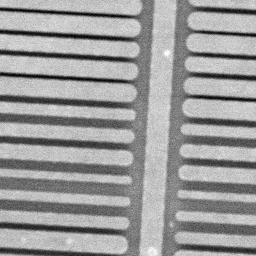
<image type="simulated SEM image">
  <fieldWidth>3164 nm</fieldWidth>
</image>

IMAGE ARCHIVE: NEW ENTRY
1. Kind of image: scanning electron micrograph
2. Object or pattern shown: groups of lines, slits or small figures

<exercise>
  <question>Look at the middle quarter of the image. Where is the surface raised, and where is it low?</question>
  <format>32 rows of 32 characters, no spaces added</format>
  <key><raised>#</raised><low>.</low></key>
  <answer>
##################....#####...##
##################....#####....#
##################....#####.....
...........#######....#####.....
#######...............#####...##
#################.....#####...##
##################....#####...##
##################...######.....
##################...#####......
.....................#####....##
.....................#####....##
################.....#####....##
##################...#####....##
........##########...#####......
.....................#####......
.....................#####....##
############.........#####....##
#################....#####....##
#################....#####......
............#####....#####......
.....................#####....##
########.............#####...###
#################....#####...###
#################...######......
.....############...######......
....................#####.....##
....................#####....###
#####...............#####....###
#################...#####....###
............####....#####.......
....................#####.......
....................#####.......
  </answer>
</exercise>